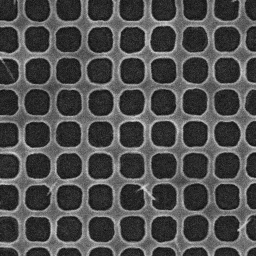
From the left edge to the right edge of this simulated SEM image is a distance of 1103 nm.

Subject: a regular array of holes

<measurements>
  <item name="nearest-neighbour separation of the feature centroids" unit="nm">134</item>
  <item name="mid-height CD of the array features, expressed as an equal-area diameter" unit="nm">117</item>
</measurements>